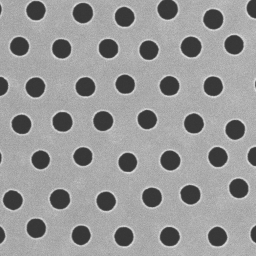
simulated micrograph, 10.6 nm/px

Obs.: a regular array of holes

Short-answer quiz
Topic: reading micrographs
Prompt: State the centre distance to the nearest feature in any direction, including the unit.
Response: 39.4 px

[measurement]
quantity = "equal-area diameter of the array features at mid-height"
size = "209 nm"